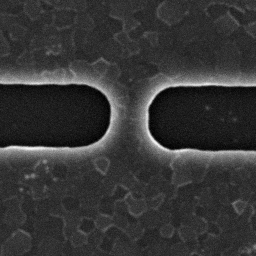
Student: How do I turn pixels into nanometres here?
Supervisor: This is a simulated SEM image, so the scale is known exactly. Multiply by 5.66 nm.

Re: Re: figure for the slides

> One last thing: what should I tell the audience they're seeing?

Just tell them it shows holes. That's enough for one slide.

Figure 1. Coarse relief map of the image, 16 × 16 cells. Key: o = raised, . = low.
oooooooooooooooo
oooooooooooooooo
oooooooooooooooo
oooooooooooooooo
oooooooooooooooo
......oooo......
.......oo.......
.......oo.......
......ooo.......
oooooooooooooooo
oooooooooooooooo
oooooooooooooooo
oooooooooooooooo
oooooooooooooooo
oooooooooooooooo
oooooooooooooooo